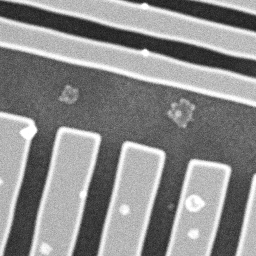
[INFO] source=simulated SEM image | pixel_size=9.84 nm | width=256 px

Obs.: groups of lines, slits or small figures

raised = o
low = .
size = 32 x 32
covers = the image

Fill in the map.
...oooooooooooooo..........ooooo
.......ooooooooooooooo.........o
o..........oooooooooooooo.......
oooooo.........ooooooooooooooo..
ooooooooo..........ooooooooooooo
oooooooooooooo..........oooooooo
....ooooooooooooooo........ooooo
........oooooooooooooo..........
.............oooooooooooooo.....
................oooooooooooooo..
.....................ooooooooooo
.........................ooooooo
.............................ooo
................................
o...............................
oooo............................
oooo...ooo......................
oooo...ooooo....................
oooo...ooooo...oooo.............
ooo....ooooo...ooooo............
ooo...oooooo...ooooo....ooo.....
ooo...ooooo....ooooo...oooooo...
ooo...ooooo....ooooo...ooooo....
oo....ooooo...oooooo...ooooo...o
oo...oooooo...ooooo....ooooo...o
oo...ooooo....ooooo...oooooo...o
oo...ooooo....ooooo...oooooo...o
o....ooooo...oooooo...ooooo....o
o...oooooo...ooooo....ooooo...oo
o...oooooo...ooooo...oooooo...oo
o...ooooo....ooooo...oooooo...oo
....ooooo...oooooo...ooooo....oo